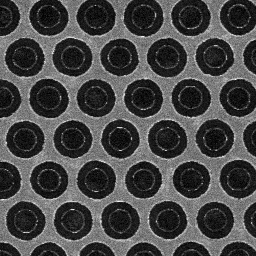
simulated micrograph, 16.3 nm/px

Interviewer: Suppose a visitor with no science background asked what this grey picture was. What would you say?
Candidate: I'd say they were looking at a regular array of ring-shaped grooves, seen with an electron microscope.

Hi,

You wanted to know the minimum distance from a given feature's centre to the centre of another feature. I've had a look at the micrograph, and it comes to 762 nm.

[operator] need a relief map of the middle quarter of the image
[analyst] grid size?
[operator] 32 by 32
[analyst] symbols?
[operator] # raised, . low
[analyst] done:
####...###...###..###...####..##
......####........####........##
.....#######.....######......###
#########################..####.
#####......######......######...
####........####........####....
.##...####...##...####..###...##
.##..######..##..#####...##..###
.##..##..##..##..######..##..###
.##...#.###..##..#####...##..###
.##...####...##...####...##...##
####........####........####....
#####......######......######...
########.##########..###########
....########.....######.....####
......#####.......####.......###
.##....###...###...##...###...##
#####..##...####...##..#####...#
#####..##..######..##..######..#
#####..##..######..##..######..#
####...##...####...##...####...#
......####...#....####........##
......#####......######......###
##..#########...########....####
######....#########..#########..
#####.......#####......######...
####...##...####....#...####..##
.##...####...###..####..###..###
.##..######..##..######..##..###
.##..######..##..#####...##..###
.##...#####..##...####..#.#..###
.###...##...####...##...#.##...#